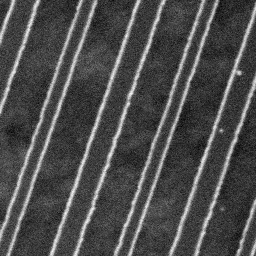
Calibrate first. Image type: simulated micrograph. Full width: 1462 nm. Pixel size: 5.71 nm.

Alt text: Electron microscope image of lines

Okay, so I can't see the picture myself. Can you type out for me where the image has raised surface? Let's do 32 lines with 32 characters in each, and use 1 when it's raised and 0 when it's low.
01111000001100000111000001100000
01110000001100000111000001100000
01110000011000001111000011000001
11110000011000001110000011000001
11100000011000001110000011000001
11100000110000011110000110000011
11100000110000011100000110000011
11000001100000011100000110000011
11000001100000111100001100000111
11000001100000111000001100000111
10000011100000111000001100000111
10000011000001111000011000001111
10000011000001110000011000001110
00000111000001110000011000001110
00000110000011110000110000011110
00000110000011100000110000011100
00001100000011100000110000011100
00001100000111100001100000111000
00001100000111000001100000111000
00011000000111000001100000111000
00011000001111000011000001110000
00011000001110000011000001110000
00110000001110000011000011110000
00110000011100000110000011100000
00110000011100000110000011100000
01100000111100000110000111100000
01100000111000001100000111000001
01100000111000001100000111000001
11000001111000011100001111000001
11000001110000011000001110000011
11000001110000011000001110000011
10000011110000110000011110000011